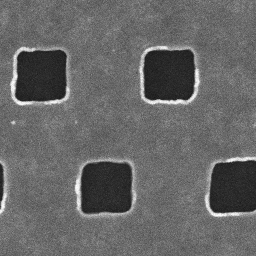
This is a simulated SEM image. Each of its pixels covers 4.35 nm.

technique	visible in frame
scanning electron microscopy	holes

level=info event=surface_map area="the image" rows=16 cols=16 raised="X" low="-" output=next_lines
XXXXXXXXXXXXXXXX
XXXXXXXXXXXXXXXX
XXXXXXXXXXXXXXXX
X---XXXXX---XXXX
X---XXXXX---XXXX
X---XXXXX---XXXX
XXXXXXXXXXXXXXXX
XXXXXXXXXXXXXXXX
XXXXXXXXXXXXXXXX
XXXXXXXXXXXXXXXX
XXXXX---XXXXX---
XXXXX---XXXXX---
XXXXX---XXXXX---
XXXXXXXXXXXXXXXX
XXXXXXXXXXXXXXXX
XXXXXXXXXXXXXXXX